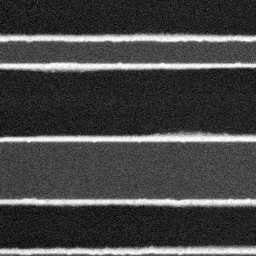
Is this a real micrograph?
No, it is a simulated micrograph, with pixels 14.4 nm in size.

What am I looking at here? lines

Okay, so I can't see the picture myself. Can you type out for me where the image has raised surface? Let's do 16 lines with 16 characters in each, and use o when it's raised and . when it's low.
................
................
oooooooooooooooo
oooooooooooooooo
................
................
................
................
................
oooooooooooooooo
oooooooooooooooo
oooooooooooooooo
oooooooooooooooo
................
................
................